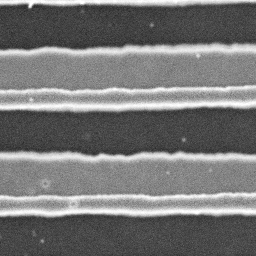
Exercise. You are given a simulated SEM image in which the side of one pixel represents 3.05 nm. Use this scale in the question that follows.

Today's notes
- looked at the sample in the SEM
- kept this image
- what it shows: lines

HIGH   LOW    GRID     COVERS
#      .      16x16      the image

................
................
................
################
################
################
################
................
................
................
################
################
################
................
................
................